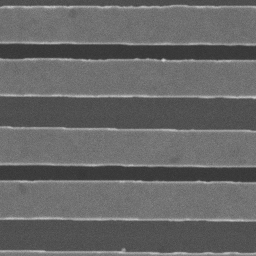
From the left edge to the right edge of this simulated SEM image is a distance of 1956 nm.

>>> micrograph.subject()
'lines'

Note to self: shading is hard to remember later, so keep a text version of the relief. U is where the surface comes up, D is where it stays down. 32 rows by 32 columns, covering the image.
DDDDDDDDDDDDDDDDDDDDDDDDDDDDDDDD
UUUUUUUUUUUUUUUUUUUUUUUUUUUUUUUU
UUUUUUUUUUUUUUUUUUUUUUUUUUUUUUUU
UUUUUUUUUUUUUUUUUUUUUUUUUUUUUUUU
UUUUUUUUUUUUUUUUUUUUUUUUUUUUUUUU
DDDDDDDDDDDDDDDUUUUUUUUUUUUUUUUU
DDDDDDDDDDDDDDDDDDDDDDDDDDDDDDDD
UUUUUUUUUUUUUUUUUUUUUDDUUDDDDDDD
UUUUUUUUUUUUUUUUUUUUUUUUUUUUUUUU
UUUUUUUUUUUUUUUUUUUUUUUUUUUUUUUU
UUUUUUUUUUUUUUUUUUUUUUUUUUUUUUUU
UUUUUUUUUUUUUUUUUUUUUUUUUUUUUUUU
DDDDDDDDDDDDDDDDDDDDDDDDDDDDDDDD
DDDDDDDDDDDDDDDDDDDDDDDDDDDDDDDD
DDDDDDDDDDDDDDDDDDDDDDDDDDDDDDDD
DDDDDDDDDDDDDDDDDDDDDDDDDDDDDDDD
UUUUUUUUUUUUUUUUUUUUUUUUUUUUUUUU
UUUUUUUUUUUUUUUUUUUUUUUUUUUUUUUU
UUUUUUUUUUUUUUUUUUUUUUUUUUUUUUUU
UUUUUUUUUUUUUUUUUUUUUUUUUUUUUUUU
UUUUUUUUUUUUUUUUUUUUUUUUUUUUUUUU
DDDDDDDDDDDDDDDDDDDDDDDDDDDDDDDD
DDDDDDDDDDDDDDDDDDDDDDDDDDDDDDDD
UUUUUUUUUUUUUUUUUUUUUUUUUUUUUUUU
UUUUUUUUUUUUUUUUUUUUUUUUUUUUUUUU
UUUUUUUUUUUUUUUUUUUUUUUUUUUUUUUU
UUUUUUUUUUUUUUUUUUUUUUUUUUUUUUUU
DDDDDDDDDDDDDDDDDDDDDDUDDDUUUUUU
DDDDDDDDDDDDDDDDDDDDDDDDDDDDDDDD
DDDDDDDDDDDDDDDDDDDDDDDDDDDDDDDD
DDDDDDDDDDDDDDDDDDDDDDDDDDDDDDDD
UUUUUUUUUUUUUUUUDDDDDDDDDDDDDDDD